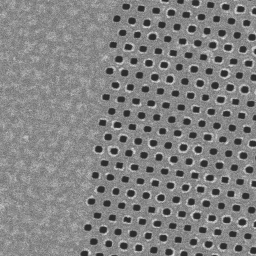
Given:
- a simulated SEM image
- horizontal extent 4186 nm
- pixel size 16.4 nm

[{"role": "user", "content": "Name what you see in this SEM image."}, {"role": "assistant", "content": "a regular array of holes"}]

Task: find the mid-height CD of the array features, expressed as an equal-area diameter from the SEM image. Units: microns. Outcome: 0.12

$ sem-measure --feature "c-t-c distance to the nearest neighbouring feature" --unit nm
244